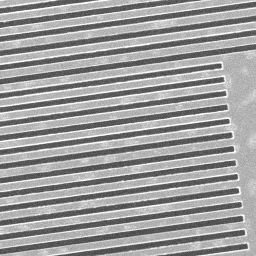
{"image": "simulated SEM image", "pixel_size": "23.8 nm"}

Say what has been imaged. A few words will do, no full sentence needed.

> parallel lines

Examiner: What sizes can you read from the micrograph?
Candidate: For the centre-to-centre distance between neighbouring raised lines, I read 333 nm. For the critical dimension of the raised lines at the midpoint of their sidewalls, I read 180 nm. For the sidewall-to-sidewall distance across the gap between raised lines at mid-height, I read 0.159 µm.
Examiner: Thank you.